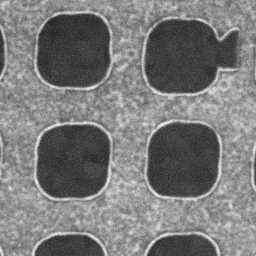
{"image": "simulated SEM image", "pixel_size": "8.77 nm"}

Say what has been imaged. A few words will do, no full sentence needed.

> raised bodies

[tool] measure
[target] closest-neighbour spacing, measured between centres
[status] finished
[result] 939 nm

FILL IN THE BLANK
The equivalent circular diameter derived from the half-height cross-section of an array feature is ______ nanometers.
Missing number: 712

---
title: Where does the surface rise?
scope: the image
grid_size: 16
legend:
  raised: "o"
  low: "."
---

................
...oooo...ooo...
..ooooo..oooooo.
..ooooo..oooooo.
..ooooo..ooooo..
....oo...oooo...
................
................
...oooo..ooooo..
..ooooo..ooooo..
..ooooo..ooooo..
..ooooo..oooo...
................
................
................
..oooo...ooooo..